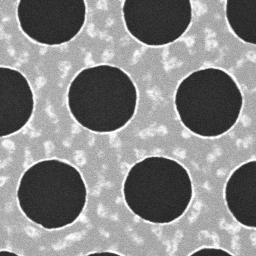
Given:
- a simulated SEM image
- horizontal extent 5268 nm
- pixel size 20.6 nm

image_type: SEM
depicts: holes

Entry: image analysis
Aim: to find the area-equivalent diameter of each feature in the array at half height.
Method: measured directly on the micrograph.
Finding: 1410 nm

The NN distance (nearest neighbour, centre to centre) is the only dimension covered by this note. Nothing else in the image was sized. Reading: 2130 nanometres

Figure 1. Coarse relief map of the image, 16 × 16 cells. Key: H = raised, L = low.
HLLLLHHHLLLLHHLL
HLLLLHHHLLLLHHLL
HHLLHHHHHLLHHHHL
HHHHHHHHHHHHHHHH
LHHHHLLLHHHHLLHH
LLHHLLLLHHHLLLLH
LLHHLLLLLHHLLLLH
LLHHHLLLHHHLLLLH
HHHHHHHHHHHHHHHH
HHHHHHHHHHHHHHHH
HHLLLHHHLLLHHHHL
HLLLLHHHLLLLHHLL
HLLLLHHHLLLLHHLL
HHLLLHHHHLLHHHHL
HHHHHHHHHHHHHHHH
HHHHHHHHHHHHHHHH